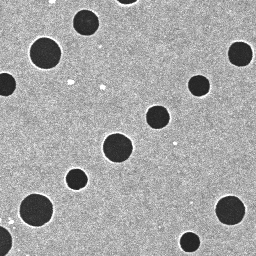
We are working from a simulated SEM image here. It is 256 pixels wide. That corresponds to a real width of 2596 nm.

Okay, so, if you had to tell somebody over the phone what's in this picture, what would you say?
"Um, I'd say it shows a regular array of holes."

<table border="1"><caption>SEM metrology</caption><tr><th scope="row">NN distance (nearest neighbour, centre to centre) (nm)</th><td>516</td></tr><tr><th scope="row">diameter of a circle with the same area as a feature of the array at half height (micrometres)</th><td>0.262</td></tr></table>